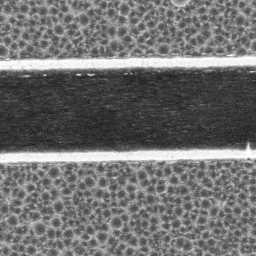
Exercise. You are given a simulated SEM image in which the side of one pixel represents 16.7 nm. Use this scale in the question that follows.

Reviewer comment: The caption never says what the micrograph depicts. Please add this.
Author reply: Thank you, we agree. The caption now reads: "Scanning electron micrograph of one or a few lines or trenches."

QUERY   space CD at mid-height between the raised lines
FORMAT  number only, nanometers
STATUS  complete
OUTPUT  1560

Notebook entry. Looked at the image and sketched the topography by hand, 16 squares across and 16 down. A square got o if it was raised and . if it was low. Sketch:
oooooooooooooooo
oooooooooooooooo
oooooooooooooooo
oooooooooooooooo
................
................
................
................
................
................
oooooooooooooooo
oooooooooooooooo
oooooooooooooooo
oooooooooooooooo
oooooooooooooooo
oooooooooooooooo